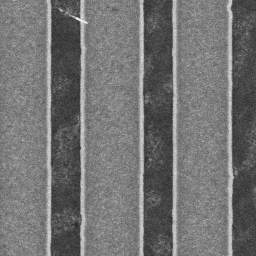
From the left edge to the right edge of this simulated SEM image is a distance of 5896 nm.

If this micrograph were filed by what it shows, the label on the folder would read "one or a few lines or trenches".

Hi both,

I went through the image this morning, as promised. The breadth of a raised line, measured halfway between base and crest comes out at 1310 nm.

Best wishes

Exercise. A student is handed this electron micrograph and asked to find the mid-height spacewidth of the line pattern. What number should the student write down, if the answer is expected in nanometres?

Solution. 774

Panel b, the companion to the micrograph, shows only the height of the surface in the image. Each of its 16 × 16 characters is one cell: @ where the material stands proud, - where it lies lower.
@@@--@@@@--@@@--
@@@--@@@@--@@@--
@@@--@@@@--@@@--
@@@--@@@@--@@@--
@@@--@@@@--@@@--
@@@--@@@@--@@@--
@@@--@@@@--@@@--
@@@--@@@@--@@@--
@@@--@@@@--@@@--
@@@--@@@@--@@@--
@@@--@@@@--@@@--
@@@--@@@@--@@@--
@@@--@@@@--@@@--
@@@--@@@@--@@@--
@@@--@@@@--@@@--
@@@--@@@@--@@@--